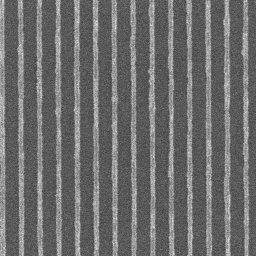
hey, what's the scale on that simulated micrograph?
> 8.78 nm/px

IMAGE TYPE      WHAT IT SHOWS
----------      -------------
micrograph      parallel lines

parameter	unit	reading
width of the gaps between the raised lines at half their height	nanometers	134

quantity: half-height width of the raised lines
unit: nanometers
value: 28.5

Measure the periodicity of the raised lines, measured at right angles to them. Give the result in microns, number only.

0.165